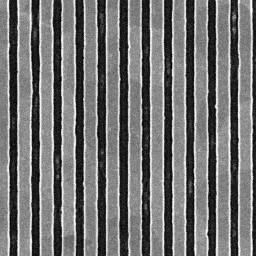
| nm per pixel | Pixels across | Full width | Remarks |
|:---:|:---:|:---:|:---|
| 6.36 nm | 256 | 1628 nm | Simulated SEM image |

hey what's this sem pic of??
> parallel lines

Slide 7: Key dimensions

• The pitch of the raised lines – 140 nm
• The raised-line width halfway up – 81.8 nm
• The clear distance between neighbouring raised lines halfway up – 0.0564 µm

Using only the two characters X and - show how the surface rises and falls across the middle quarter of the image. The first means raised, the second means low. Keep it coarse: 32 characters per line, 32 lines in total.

XXX--XXX---XXX--XXX---XXX--XXX--
XXX--XXX---XXX--XXX---XXX--XXX--
XXX--XXX---XXX--XXX---XXX--XXX--
XXX--XXX---XXX--XXX---XXX--XXX--
XXX--XXX---XXX--XXX---XXX--XXX--
XXX--XXX---XXX--XXX---XXX--XXX--
XXX--XXX---XXX--XXX---XXX--XXX--
XXX--XXX---XXX--XXX---XXX--XXX--
XXX--XXX---XXX--XXX---XXX--XXX--
XXX--XXX---XXX--XXX---XXX--XXX--
XXX--XXX---XXX--XXX---XXX--XXX--
XXX--XXX---XXX--XXX---XXX--XXX--
XXX--XXX---XXX--XXX---XXX--XXX--
XXX--XXX---XXX--XXX---XXX--XXX--
XXX--XXX---XXX--XXX---XXX--XXX--
XXX--XXX---XXX--XXX---XXX--XXX--
XXX--XXX---XXX--XXX---XXX--XXX--
XXX--XXX---XXX--XXX---XXX--XXX--
XXX--XXX---XXX--XXX---XXX--XXX--
XXX--XXX---XXX--XXX---XXX--XXX--
XXX--XXX---XXX--XXX---XXX--XXX--
XXX--XXX---XXX--XXX---XXX--XXX--
XXX--XXX---XXX--XXX---XXX--XXX--
XXX--XXX---XXX--XXX---XXX--XXX--
XXX--XXX---XXX--XXX---XXX--XXX--
XXX--XXX---XXX--XXX---XXX--XXX--
XXX--XXX---XXX--XXX---XXX--XXX--
XXX--XXX---XXX--XXX---XXX--XXX--
XXX--XXX---XXX--XXX---XXX--XXX--
XXX--XXX---XXX--XXX---XXX--XXX--
XXX--XXX---XXX--XXX---XXX--XXX--
XXX--XXX---XXX--XXX---XXX--XXX--